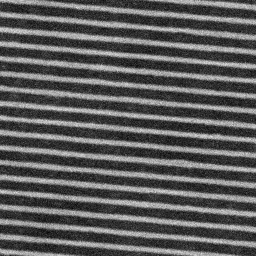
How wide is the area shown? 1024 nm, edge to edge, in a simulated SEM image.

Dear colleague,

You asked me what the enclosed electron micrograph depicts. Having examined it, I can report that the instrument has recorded parallel lines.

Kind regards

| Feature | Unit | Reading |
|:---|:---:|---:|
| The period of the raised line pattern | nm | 59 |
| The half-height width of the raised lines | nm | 16.4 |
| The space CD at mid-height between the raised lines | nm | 42.8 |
